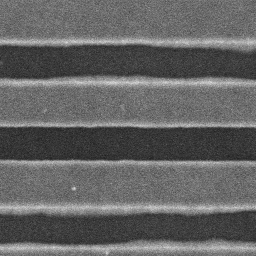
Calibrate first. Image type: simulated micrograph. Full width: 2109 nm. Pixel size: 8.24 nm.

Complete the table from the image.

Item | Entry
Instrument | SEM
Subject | lines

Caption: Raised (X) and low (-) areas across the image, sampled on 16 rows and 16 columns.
XXXXXXXXXXXXXXXX
XXXXXXXXXXXXXXXX
XXXXXXXXXXXXXXXX
----------------
----------------
XXXXXXXXXXXXXXXX
XXXXXXXXXXXXXXXX
XXXXXXXXXXXXXXXX
----------------
----------------
XXXXXXXXXXXXXXXX
XXXXXXXXXXXXXXXX
XXXXXXXXXXXXXXXX
----------------
----------------
XXXXXXXXXXXXXXXX